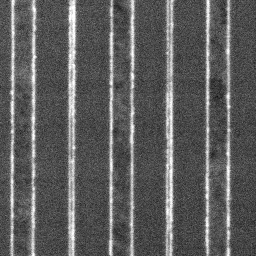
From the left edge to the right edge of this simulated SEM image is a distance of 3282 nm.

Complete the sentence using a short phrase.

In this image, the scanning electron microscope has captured lines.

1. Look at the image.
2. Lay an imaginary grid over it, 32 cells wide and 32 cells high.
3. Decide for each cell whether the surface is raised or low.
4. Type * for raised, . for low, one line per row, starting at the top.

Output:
..**..........***.........***...
..**..........***.........***...
..**..........***.........***...
..**..........***.........***...
..**..........***.........***...
..**..........***.........***...
..**..........***.........***...
..**..........***.........***...
..**..........***.........***...
..**..........***.........***...
..**..........***.........***...
..**..........***.........***...
..**..........***.........***...
..**..........***.........***...
..**..........***.........***...
..**..........***.........***...
..**..........***.........***...
..**..........***.........***...
..**..........***.........***...
..**..........***.........***...
..**..........***.........***...
..**..........***.........***...
..**..........***.........***...
..**..........***.........***...
..**..........***.........***...
..**..........***.........**....
..**..........***.........***...
..**..........***.........***...
..**..........***.........***...
..**..........***.........***...
..**..........***.........**....
..**..........***.........***...